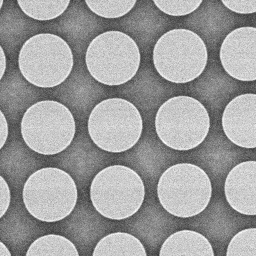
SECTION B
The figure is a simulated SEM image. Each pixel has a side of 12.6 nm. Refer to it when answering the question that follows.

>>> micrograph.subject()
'an array of small figures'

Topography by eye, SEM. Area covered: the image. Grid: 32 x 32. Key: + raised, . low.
..+++++++..++++++..++++++...++++
...+++++....++++.....+++......++
................................
..............................++
....+++.....++++....+++++...++++
...+++++...++++++...+++++...++++
...++++++..++++++..+++++++..++++
+.+++++++..++++++..+++++++..++++
+..++++++..++++++...++++++..++++
...+++++....+++++...+++++....+++
....+++......++.................
................................
.............++......+++.....+++
....++++....+++++...++++++..++++
...++++++..+++++++..++++++..++++
+..++++++..+++++++.+++++++..++++
+..++++++..+++++++..++++++..++++
+..++++++...+++++...+++++....+++
....++++.....+++......++........
................................
..............................++
.....+++.....++++....++++....+++
....+++++...++++++..++++++..++++
+..+++++++.+++++++..++++++..++++
+..+++++++.+++++++..++++++..++++
+..++++++...++++++..++++++...+++
+...+++++...+++++....++++.....++
.....++.........................
................................
......+......+++.....++++....+++
....+++++...++++++...+++++...+++
+..+++++++..++++++..+++++++.++++